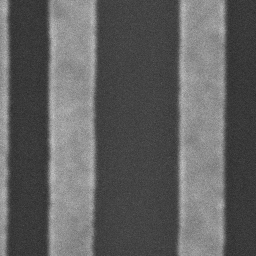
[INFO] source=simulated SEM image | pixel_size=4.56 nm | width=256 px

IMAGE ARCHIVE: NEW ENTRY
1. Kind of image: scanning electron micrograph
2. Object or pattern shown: lines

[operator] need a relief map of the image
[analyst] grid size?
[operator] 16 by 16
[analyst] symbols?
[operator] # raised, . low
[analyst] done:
...###.....###..
...###.....###..
...###.....###..
...###.....###..
...###.....###..
...###.....###..
...###.....###..
...###.....###..
...###.....###..
...###.....###..
...###.....###..
...###.....###..
...###.....###..
...###.....###..
...###.....###..
...###.....###..